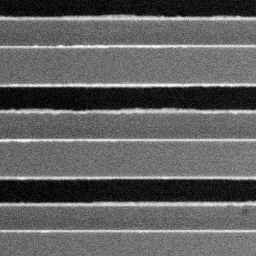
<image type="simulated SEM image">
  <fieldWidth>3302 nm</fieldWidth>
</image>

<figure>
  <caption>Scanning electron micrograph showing lines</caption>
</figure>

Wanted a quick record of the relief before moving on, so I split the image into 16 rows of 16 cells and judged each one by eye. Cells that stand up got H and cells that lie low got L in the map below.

LLLLLLLLLLLLLLLL
HHHHHHHHHHHHHHHH
HHHHHHHHHHHHHHHH
HHHHHHHHHHHHHHHH
HHHHHHHHHHHHHHHH
LLLLLLLLLLLLLLLL
LLLLLLLLLLLLLLLL
HHHHHHHHHHHHHHHH
HHHHHHHHHHHHHHHH
HHHHHHHHHHHHHHHH
HHHHHHHHHHHHHHHH
LLLLLLLLLLLLLLLL
LLLLLLLLLLLLLLLL
HHHHHHHHHHHHHHHH
HHHHHHHHHHHHHHHH
HHHHHHHHHHHHHHHH